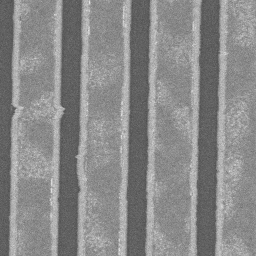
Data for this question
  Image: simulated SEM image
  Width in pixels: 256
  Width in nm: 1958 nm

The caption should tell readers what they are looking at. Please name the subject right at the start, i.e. one or a few lines or trenches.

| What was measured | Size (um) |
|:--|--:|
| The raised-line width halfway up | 0.317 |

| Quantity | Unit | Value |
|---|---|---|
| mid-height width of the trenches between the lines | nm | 208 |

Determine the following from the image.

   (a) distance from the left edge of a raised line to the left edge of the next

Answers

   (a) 68.7 px